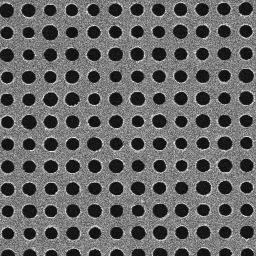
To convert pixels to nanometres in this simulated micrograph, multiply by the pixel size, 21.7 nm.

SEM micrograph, a regular array of holes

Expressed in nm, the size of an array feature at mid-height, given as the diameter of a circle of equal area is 284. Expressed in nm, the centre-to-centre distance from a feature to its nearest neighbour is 466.